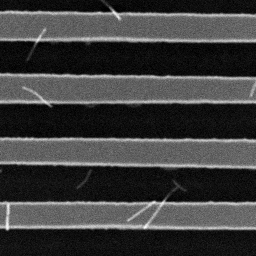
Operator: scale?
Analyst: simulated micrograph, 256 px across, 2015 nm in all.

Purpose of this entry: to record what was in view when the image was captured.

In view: lines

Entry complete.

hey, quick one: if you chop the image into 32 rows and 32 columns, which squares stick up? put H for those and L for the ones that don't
LLLLLLLLLLLLLLLLLLLLLLLLLLLLLLLL
HHHLHLLLLLLLLHHLLLLLLLLLLLLLLLLL
HHHHHHHHHHHHHHHHHHHHHHHHHHHHHHHH
HHHHHHHHHHHHHHHHHHHHHHHHHHHHHHHH
HHHHHHHHHHHHHHHHHHHHHHHHHHHHHHHH
LLLLLLLLLLLLLLLLLLLLLLLLLLLLLLLL
LLLLLLLLLLLLLLLLLLLLLLLLLLLLLLLL
LLLLLLLLLLLLLLLLLLLLLLLLLLLLLLLL
LLLLLLLLLLLLLLLLLLLLLLLLLLLLLLLL
HHHHHHHHHHHHHHHHHHHHHHLLLLLLLLLL
HHHHHHHHHHHHHHHHHHHHHHHHHHHHHHHH
HHHHHHHHHHHHHHHHHHHHHHHHHHHHHHHH
HHHHHHHHHHHHHHHHHHHHHHHHHHHHHHHH
LLLLLLLLLLLLLLLLLLLLLLLLLLLLLLLL
LLLLLLLLLLLLLLLLLLLLLLLLLLLLLLLL
LLLLLLLLLLLLLLLLLLLLLLLLLLLLLLLL
LLLLLLLLLLLLLLLLLLLLLLLLLLLLLLLL
HHHHHHHHHHHHHHHHHHHHHHHHHHHHHHHH
HHHHHHHHHHHHHHHHHHHHHHHHHHHHHHHH
HHHHHHHHHHHHHHHHHHHHHHHHHHHHHHHH
LLLHHHHHHHHHHHHHHHHHHHHHHHHHHHHH
LLLLLLLLLLLLLLLLLLLLLLLLLLLLLLLL
LLLLLLLLLLLLLLLLLLLLLLLLLLLLLLLL
LLLLLLLLLLLLLLLLLLLLLLLLLLLLLLLL
LLLLLLLLLLLLLLLLLLLLLLLLLLLLLLLL
HHHHHHHHHHHHHHHHHHHHHHHHHHHHHHHH
HHHHHHHHHHHHHHHHHHHHHHHHHHHHHHHH
HHHHHHHHHHHHHHHHHHHHHHHHHHHHHHHH
HHHHHHHHHHHHHHHHHHHHHHHHHHHHHHHH
LLLLLLLLLLLLLLLLLLLLLLLLLLLLLLLL
LLLLLLLLLLLLLLLLLLLLLLLLLLLLLLLL
LLLLLLLLLLLLLLLLLLLLLLLLLLLLLLLL